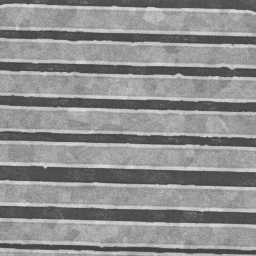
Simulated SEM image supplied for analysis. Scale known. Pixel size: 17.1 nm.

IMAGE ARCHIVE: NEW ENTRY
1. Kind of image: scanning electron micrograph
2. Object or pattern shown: parallel lines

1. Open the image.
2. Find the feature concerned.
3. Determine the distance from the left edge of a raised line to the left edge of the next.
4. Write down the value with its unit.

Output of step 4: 609 nanometers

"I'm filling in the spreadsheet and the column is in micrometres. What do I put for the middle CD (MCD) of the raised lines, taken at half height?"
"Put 0.382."